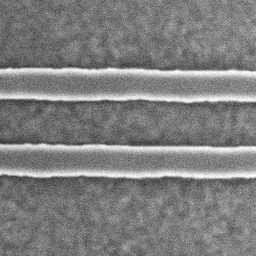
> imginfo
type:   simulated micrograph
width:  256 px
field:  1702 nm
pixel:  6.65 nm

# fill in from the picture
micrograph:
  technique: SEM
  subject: lines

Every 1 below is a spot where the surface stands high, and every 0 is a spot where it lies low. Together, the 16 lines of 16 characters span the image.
0000000000000000
0000000000000000
0000000000000000
0000000000000000
1111111111111111
1111111111111111
0000000000000000
0000000000000000
0000000000000000
1111111111111111
1111111111111111
0000000000000000
0000000000000000
0000000000000000
0000000000000000
0000000000000000